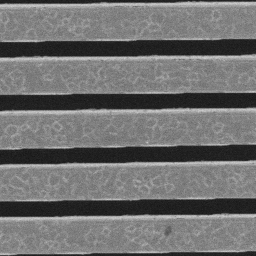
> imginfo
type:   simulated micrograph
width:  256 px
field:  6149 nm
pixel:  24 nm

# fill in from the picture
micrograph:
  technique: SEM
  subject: lines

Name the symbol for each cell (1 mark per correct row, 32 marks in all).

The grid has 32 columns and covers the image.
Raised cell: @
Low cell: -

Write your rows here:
-------------@@@@@@@@@@@@@@@@@@@
@@@@@@@@@@@@@@@@@@@@@@@@@@@@@@@@
@@@@@@@@@@@@@@@@@@@@@@@@@@@@@@@@
@@@@@@@@@@@@@@@@@@@@@@@@@@@@@@@@
@@@@@@@@@@@@@@@@@@@@@@@@@@@@@@@@
--------------------------------
--------------------------------
@@@@@@@@@@@@@@@@@@@@@@@@@@@@@@@@
@@@@@@@@@@@@@@@@@@@@@@@@@@@@@@@@
@@@@@@@@@@@@@@@@@@@@@@@@@@@@@@@@
@@@@@@@@@@@@@@@@@@@@@@@@@@@@@@@@
@@@@@@@@@@@@@@@@@@@@@@@@@@@@@@@@
--------------------------------
--------------------------------
@@@@@@@@@@@@@@@@@@@@@@@@@@@@@@@@
@@@@@@@@@@@@@@@@@@@@@@@@@@@@@@@@
@@@@@@@@@@@@@@@@@@@@@@@@@@@@@@@@
@@@@@@@@@@@@@@@@@@@@@@@@@@@@@@@@
@@@-----------------------------
--------------------------------
----------@@@@@@@@@@@@@@@@@@@@@@
@@@@@@@@@@@@@@@@@@@@@@@@@@@@@@@@
@@@@@@@@@@@@@@@@@@@@@@@@@@@@@@@@
@@@@@@@@@@@@@@@@@@@@@@@@@@@@@@@@
@@@@@@@@@@@@@@@@@@@@@@@@@@@@@@@@
--------------------------------
--------------------------------
@@@@@@@@@@@@@@@@@@@@@@@@@@@@@@@@
@@@@@@@@@@@@@@@@@@@@@@@@@@@@@@@@
@@@@@@@@@@@@@@@@@@@@@@@@@@@@@@@@
@@@@@@@@@@@@@@@@@@@@@@@@@@@@@@@@
@@@@@@@@@@@@@@@@@@@@@-----------